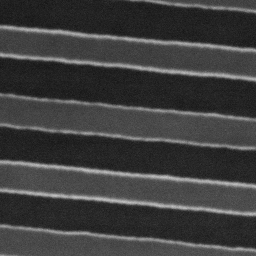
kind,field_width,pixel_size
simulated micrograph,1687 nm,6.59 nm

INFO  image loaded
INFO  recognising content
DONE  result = lines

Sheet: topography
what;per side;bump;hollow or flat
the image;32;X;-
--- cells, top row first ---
---------------------XXXXXXXXXXX
-------------------------------X
--------------------------------
XXX-----------------------------
XXXXXXXXXXXXXX------------------
XXXXXXXXXXXXXXXXXXXXXXXXX-------
XXXXXXXXXXXXXXXXXXXXXXXXXXXXXXXX
-----XXXXXXXXXXXXXXXXXXXXXXXXXXX
-----------------XXXXXXXXXXXXXXX
---------------------------XXXXX
--------------------------------
--------------------------------
XXXXXX--------------------------
XXXXXXXXXXXXXXXX----------------
XXXXXXXXXXXXXXXXXXXXXXXXXXXXX---
XXXXXXXXXXXXXXXXXXXXXXXXXXXXXXXX
--------XXXXXXXXXXXXXXXXXXXXXXXX
------------------XXXXXXXXXXXXXX
------------------------------XX
--------------------------------
XXXXX---------------------------
XXXXXXXXXXXXXX------------------
XXXXXXXXXXXXXXXXXXXXXXXXX-------
XXXXXXXXXXXXXXXXXXXXXXXXXXXXXXXX
-------XXXXXXXXXXXXXXXXXXXXXXXXX
------------------XXXXXXXXXXXXXX
---------------------------XXXXX
--------------------------------
XXX-----------------------------
XXXXXXXXXXXXX-------------------
XXXXXXXXXXXXXXXXXXXXXXXX--------
XXXXXXXXXXXXXXXXXXXXXXXXXXXXXXXX